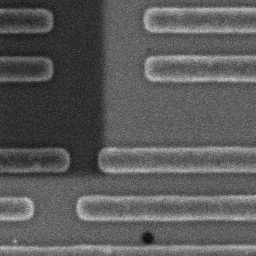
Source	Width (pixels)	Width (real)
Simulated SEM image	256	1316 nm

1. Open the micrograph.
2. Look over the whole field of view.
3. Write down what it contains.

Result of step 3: wiring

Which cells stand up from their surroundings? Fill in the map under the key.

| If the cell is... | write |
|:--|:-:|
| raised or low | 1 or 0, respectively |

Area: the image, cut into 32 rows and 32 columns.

00000000000000000000000000000000
11111100000000000001111111111111
11111100000000000011111111111111
11111100000000000001111111111111
00000000000000000000000000000000
00000000000000000000000000000000
00000000000000000000000000000000
11111100000000000001111111111111
11111100000000000011111111111111
11111100000000000011111111111111
00000000000000000000000000000000
00000000000000000000000000000000
00000000000000000000000000000000
00000000000000000000000000000000
00000000000000000000000000000000
00000000000000000000000000000000
00000000000000000000000000000000
00000000000000000000000000000000
00000000000000000000000000000000
11111111000011111111111111111111
11111111000011111111111111111111
00000000000000000000000000000000
00000000000000000000000000000000
00000000000000000000000000000000
00000000000000000000000000000000
11110000001111111111111111111111
11110000001111111111111111111111
00000000000000000000000000000000
00000000000000000000000000000000
00000000000000000000000000000000
00000000000000000000000000000000
11111111111111111111111111111111